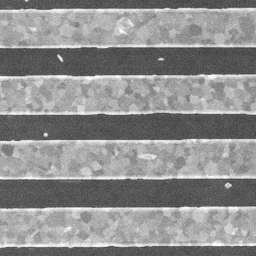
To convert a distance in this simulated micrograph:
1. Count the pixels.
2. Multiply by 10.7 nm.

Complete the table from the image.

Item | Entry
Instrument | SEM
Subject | lines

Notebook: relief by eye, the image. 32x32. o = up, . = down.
................................
oooooooooooooooooooooooooooooooo
oooooooooooooooooooooooooooooooo
oooooooooooooooooooooooooooooooo
oooooooooooooooooooooooooooooooo
oooooooooooooooooooooooooooooooo
................................
................................
................................
...............................o
oooooooooooooooooooooooooooooooo
oooooooooooooooooooooooooooooooo
oooooooooooooooooooooooooooooooo
oooooooooooooooooooooooooooooooo
................................
................................
................................
...........................ooooo
oooooooooooooooooooooooooooooooo
oooooooooooooooooooooooooooooooo
oooooooooooooooooooooooooooooooo
oooooooooooooooooooooooooooooooo
................................
................................
................................
................................
oooooooooooooooooooooooooooooooo
oooooooooooooooooooooooooooooooo
oooooooooooooooooooooooooooooooo
oooooooooooooooooooooooooooooooo
oooooooooooooooooooooooooooooooo
................................